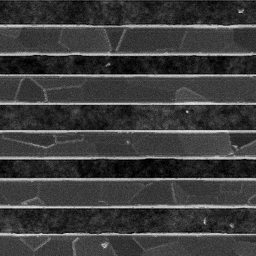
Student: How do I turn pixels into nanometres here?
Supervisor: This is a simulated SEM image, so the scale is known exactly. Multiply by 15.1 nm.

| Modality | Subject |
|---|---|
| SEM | lines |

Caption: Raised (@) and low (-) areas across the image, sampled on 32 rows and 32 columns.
--------------------------------
--------------------------------
--------------------------------
@@@@@@@@@@@@@@@@@@@@@@@@@@@@@@@@
@@@@@@@@@@@@@@@@@@@@@@@@@@@@@@@@
@@@@@@@@@@@@@@@@@@@@@@@@@@@@@@@@
@@@@@@@@@@@@@@@@@@@@@@@@@@@@@@@@
--------------------------------
--------------------------------
@@@@@@@@@@@@@@@@@@@@@@@@@@@@@@@@
@@@@@@@@@@@@@@@@@@@@@@@@@@@@@@@@
@@@@@@@@@@@@@@@@@@@@@@@@@@@@@@@@
@@@@@@@@@@@@@@@@@@@@@@@@@@@@@@@@
--------------------------------
--------------------------------
--------------------------------
@@@@@@@@@@@@@@@@@@@@@@@@@@@@@@@@
@@@@@@@@@@@@@@@@@@@@@@@@@@@@@@@@
@@@@@@@@@@@@@@@@@@@@@@@@@@@@@@@@
@@@@@@@@@@@@@@@@@@@@@@@@@@@@@@@@
--------------------------------
--------------------------------
@@@@@@@@@@@@@@@@@@@@@@@@@@@@@@@@
@@@@@@@@@@@@@@@@@@@@@@@@@@@@@@@@
@@@@@@@@@@@@@@@@@@@@@@@@@@@@@@@@
@@@@@@@@@@@@@@@@@@@@@@@@@@@@@@@@
--------------------------------
--------------------------------
--------------------------------
@@@@@@@@@@@@@@@@@@@@@@@@@@@@@@@@
@@@@@@@@@@@@@@@@@@@@@@@@@@@@@@@@
@@@@@@@@@@@@@@@@@@@@@@@@@@@@@@@@